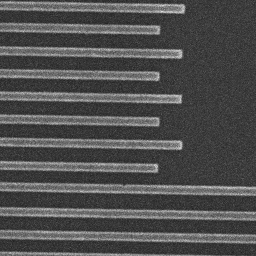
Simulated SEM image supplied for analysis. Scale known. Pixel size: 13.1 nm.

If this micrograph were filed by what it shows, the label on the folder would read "parallel lines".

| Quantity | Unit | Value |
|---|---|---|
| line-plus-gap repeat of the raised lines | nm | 303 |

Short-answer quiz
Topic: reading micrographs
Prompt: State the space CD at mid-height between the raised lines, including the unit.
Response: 203 nanometres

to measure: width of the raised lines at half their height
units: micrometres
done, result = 0.101